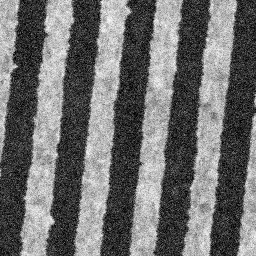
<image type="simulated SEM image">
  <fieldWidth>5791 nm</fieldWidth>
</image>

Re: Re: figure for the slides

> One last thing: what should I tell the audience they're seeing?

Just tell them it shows parallel lines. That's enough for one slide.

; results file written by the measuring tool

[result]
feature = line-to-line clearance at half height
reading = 692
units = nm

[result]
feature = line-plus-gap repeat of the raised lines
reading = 1220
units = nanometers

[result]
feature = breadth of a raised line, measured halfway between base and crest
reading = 536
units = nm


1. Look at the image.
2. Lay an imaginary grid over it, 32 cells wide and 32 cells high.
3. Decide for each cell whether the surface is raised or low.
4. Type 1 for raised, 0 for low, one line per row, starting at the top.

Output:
11000011100001110000111000111000
11000011100001110000110000111000
11000011100001110001110000111000
11000011100001100001110000111000
11000011100011100001110000111000
11000011000011100001110000111000
11000111000011100001110000111000
10000111000011100001110001111000
11000111000011100001110001111000
10000111000011100001110001111000
10000111000011100001100001110000
10000111000011100011100001110000
10000111000111000011100001110000
10000111000111000011100001110000
10000111000111000011100001110000
00001110000111000011100001110000
00001110000111000011100001110000
00001110000111000011100001100001
00001110000111000011000001100001
00001110000111000011000001100001
00001110000111000011100001100001
00001110000111000111000011100001
00001110001111000111000011100001
00011110001111000111000011100001
00011110001110000111000011100001
00011100001110000111000011100001
00011100001110000111000011100011
00011110001110000111000011100011
00011100001110000111000011000011
00011100001110000111000111000011
00011100001110001110000111000011
00011100001100001110000111000011